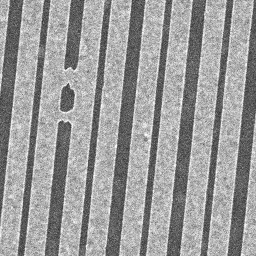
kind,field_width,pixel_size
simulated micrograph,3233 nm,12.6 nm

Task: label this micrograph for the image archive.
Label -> parallel lines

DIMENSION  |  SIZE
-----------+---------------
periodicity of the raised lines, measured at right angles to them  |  378 nm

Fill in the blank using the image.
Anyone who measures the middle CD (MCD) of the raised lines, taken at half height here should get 248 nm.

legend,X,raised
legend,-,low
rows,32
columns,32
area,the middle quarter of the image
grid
---XXXXX--XXXXX----XXXXX--XXXX--
-X-XXXXX--XXXXX----XXXX---XXXX--
XXXXXXXX--XXXXX----XXXX--XXXXX--
XXXXXXXX--XXXXX----XXXX--XXXXX--
XXXXXXXX--XXXXX---XXXXX--XXXXX--
--XXXXXX--XXXXX---XXXXX--XXXXX--
--XXXXXX--XXXX----XXXXX--XXXXX--
---XXXXX--XXXX----XXXXX--XXXXX--
---XXXX---XXXX----XXXXX--XXXXX--
---XXXX--XXXXX----XXXXX--XXXX---
---XXXX--XXXXX----XXXXX--XXXX---
--XXXXX--XXXXX----XXXX--XXXXX---
XXXXXXX--XXXXX----XXXX--XXXXX---
XXXXXXX--XXXXX---XXXXX--XXXXX---
-XXXXXX--XXXXX---XXXXX--XXXXX---
--XXXXX--XXXX----XXXXX--XXXXX---
--XXXXX--XXXX----XXXXX--XXXXX---
--XXXXX--XXXX----XXXXX--XXXXX---
--XXXX---XXXX----XXXXX--XXXX----
--XXXX--XXXXX----XXXXX--XXXX----
--XXXX--XXXXX----XXXX---XXXX----
-XXXXX--XXXXX----XXXX---XXXX----
-XXXXX--XXXXX----XXXX--XXXXX----
-XXXXX--XXXXX---XXXXX--XXXXX----
-XXXXX--XXXXX---XXXXX--XXXXX----
-XXXXX--XXXXX---XXXXX--XXXXX----
-XXXXX--XXXX----XXXXX--XXXXX---X
-XXXXX--XXXX----XXXXX--XXXXX---X
-XXXX--XXXXX----XXXXX--XXXX----X
-XXXX--XXXXX----XXXXX--XXXX----X
XXXXX--XXXXX----XXXX--XXXXX----X
XXXXX--XXXXX----XXXX--XXXXX----X